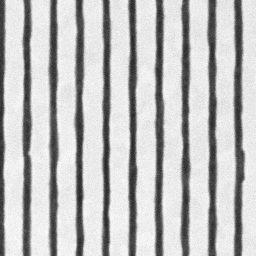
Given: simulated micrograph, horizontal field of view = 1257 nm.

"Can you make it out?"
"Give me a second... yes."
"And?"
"parallel lines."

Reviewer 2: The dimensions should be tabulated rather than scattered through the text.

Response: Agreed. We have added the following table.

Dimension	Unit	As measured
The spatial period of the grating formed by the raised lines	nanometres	130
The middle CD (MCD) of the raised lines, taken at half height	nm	95.1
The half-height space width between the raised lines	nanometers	36.8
